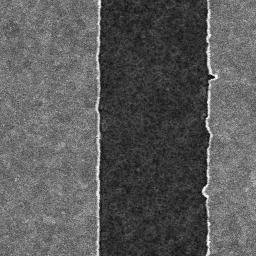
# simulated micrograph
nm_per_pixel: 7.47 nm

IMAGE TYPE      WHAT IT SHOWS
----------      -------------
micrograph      one or a few lines or trenches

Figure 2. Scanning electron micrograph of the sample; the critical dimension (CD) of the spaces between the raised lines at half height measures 809 nanometers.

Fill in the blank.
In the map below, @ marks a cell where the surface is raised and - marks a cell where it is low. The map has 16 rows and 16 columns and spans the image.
@@@@@@-------@@@
@@@@@@-------@@@
@@@@@@-------@@@
@@@@@@-------@@@
@@@@@@-------@@@
@@@@@@-------@@@
@@@@@@-------@@@
@@@@@@-------@@@
@@@@@@-------@@@
@@@@@@-------@@@
@@@@@@-------@@@
@@@@@@-------@@@
@@@@@@-------@@@
@@@@@@-------@@@
@@@@@@-------@@@
@@@@@@-------@@@